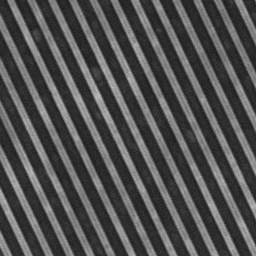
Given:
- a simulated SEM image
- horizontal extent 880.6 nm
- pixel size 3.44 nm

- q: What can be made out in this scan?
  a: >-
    parallel lines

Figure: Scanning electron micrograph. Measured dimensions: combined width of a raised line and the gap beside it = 64.3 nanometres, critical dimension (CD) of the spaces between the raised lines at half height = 0.0439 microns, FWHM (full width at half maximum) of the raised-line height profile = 21.8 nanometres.